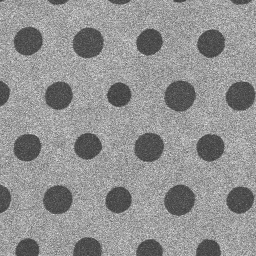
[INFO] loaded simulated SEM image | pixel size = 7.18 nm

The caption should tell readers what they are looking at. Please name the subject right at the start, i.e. a regular array of holes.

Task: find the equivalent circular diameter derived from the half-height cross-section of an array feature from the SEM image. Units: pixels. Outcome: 27.9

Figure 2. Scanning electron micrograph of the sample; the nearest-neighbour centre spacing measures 432 nm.